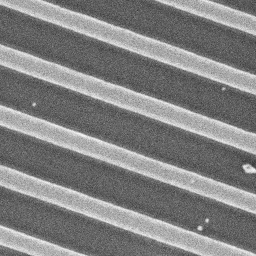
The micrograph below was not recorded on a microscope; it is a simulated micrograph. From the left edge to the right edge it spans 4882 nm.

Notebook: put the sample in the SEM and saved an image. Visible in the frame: lines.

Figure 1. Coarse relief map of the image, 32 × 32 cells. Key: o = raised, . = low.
oooooo...............oooooo.....
...oooooo...............oooooo..
......oooooo...............ooooo
........ooooooo..............ooo
...........ooooooo..............
..............ooooooo...........
ooo..............ooooooo........
ooooo...............oooooo......
.ooooooo...............oooooo...
....ooooooo..............ooooooo
.......ooooooo..............oooo
..........ooooooo..............o
.............ooooooo............
o...............ooooooo.........
oooo..............ooooooo.......
oooooo...............ooooooo....
...oooooo...............ooooooo.
......oooooo...............ooooo
........ooooooo...............oo
...........ooooooo..............
..............ooooooo...........
oo...............ooooooo........
ooooo...............ooooooo.....
.ooooooo...............oooooo...
....ooooooo...............oooooo
.......ooooooo..............oooo
..........ooooooo..............o
.............ooooooo............
o..............ooooooo..........
oooo..............ooooooo.......
oooooo...............ooooooo....
...oooooo...............ooooooo.